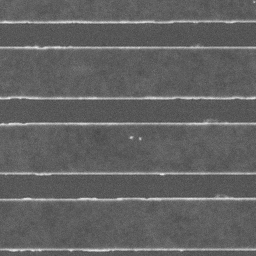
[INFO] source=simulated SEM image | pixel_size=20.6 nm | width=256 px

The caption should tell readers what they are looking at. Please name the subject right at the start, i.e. lines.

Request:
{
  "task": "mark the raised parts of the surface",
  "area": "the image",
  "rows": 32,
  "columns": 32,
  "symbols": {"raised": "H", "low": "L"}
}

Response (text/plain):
HHHHHHHHHHHHHHHHHHHHHHHHHHHHHHHH
HHHHHHHHHHHHHHHHHHHHHHHHHHHHHHHH
HHHHHHHHHHHHHHHHHHHHHHHHHHHHHHHH
LLLLLLLLLLLLLLLLLLLLLLLLLLLLLLLL
LLLLLLLLLLLLLLLLLLLLLLLLLLLLLLLL
LLLLLLLLLLLLLLLLLLLLLLLLLLLLLLLL
HHHHHHHHHHHHHHHHHHHHHHHHHHHHHHHH
HHHHHHHHHHHHHHHHHHHHHHHHHHHHHHHH
HHHHHHHHHHHHHHHHHHHHHHHHHHHHHHHH
HHHHHHHHHHHHHHHHHHHHHHHHHHHHHHHH
HHHHHHHHHHHHHHHHHHHHHHHHHHHHHHHH
HHHHHHHHHHHHHHHHHHHHHHHHHHHHHHHH
LLLLLLLLLLLLLLLLLLLLLLLLLLLLLLLL
LLLLLLLLLLLLLLLLLLLLLLLLLLLLLLLL
LLLLLLLLLLLLLLLLLLLLLLLLLLLLLLLL
LHHHHHHHHHHHHHHHHHHHHHHHHHHHHHHH
HHHHHHHHHHHHHHHHHHHHHHHHHHHHHHHH
HHHHHHHHHHHHHHHHHHHHHHHHHHHHHHHH
HHHHHHHHHHHHHHHHHHHHHHHHHHHHHHHH
HHHHHHHHHHHHHHHHHHHHHHHHHHHHHHHH
HHHHHHHHHHHHHHHHHHHHHHHHHHHHHHHH
HHHHHHHHHHHHHHHHHHHHHHHHHHHHHHHH
LLLLLLLLLLLLLLLLLLLLLLLLLLLLLLLL
LLLLLLLLLLLLLLLLLLLLLLLLLLLLLLLL
LLLLLLLLLLLLLLLLLLLLLLLLLLLLLLLL
HHHHHHHHHHHHHHHHHHHHHHHHHHHHHHHH
HHHHHHHHHHHHHHHHHHHHHHHHHHHHHHHH
HHHHHHHHHHHHHHHHHHHHHHHHHHHHHHHH
HHHHHHHHHHHHHHHHHHHHHHHHHHHHHHHH
HHHHHHHHHHHHHHHHHHHHHHHHHHHHHHHH
HHHHHHHHHHHHHHHHHHHHHHHHHHHHHHHH
LLLLLLLLLLLLLLLLLLLLLLLLLLLLLLLL